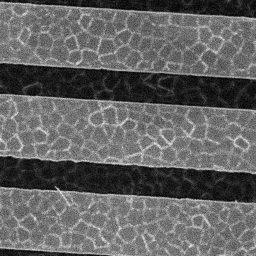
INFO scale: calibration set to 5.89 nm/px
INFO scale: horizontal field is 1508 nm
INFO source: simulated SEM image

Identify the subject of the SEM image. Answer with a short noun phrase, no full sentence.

one or a few lines or trenches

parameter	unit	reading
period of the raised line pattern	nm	540